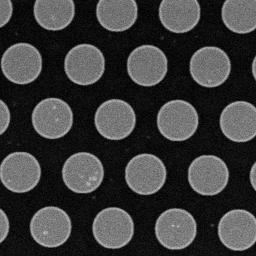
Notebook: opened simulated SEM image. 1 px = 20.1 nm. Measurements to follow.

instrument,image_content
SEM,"an array of small figures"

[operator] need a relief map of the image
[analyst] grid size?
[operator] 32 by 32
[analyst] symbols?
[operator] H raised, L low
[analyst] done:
HLLLHHHHHLLLHHHHHLLLHHHHHLLLHHHH
HHLLHHHHHLLLHHHHHLLLHHHHHLLLHHHH
HLLLLHHHHLLLHHHHHLLLHHHHHLLLHHHH
LLLLLLHHLLLLLHHHLLLLLHHHLLLLLHHH
LLLLLLLLLLLLLLLLLLLLLLLLLLLLLLLL
LLHLLLLLLLLLLLLLLLLLLLLLLLLLLLLL
LHHHHLLLLHHHHLLLHHHHLLLLLHHHLLLL
HHHHHLLLHHHHHLLLHHHHHLLLHHHHHLLL
HHHHHLLLHHHHHLLLHHHHHLLLHHHHHLLL
LHHHHLLLHHHHHLLLHHHHHLLLHHHHHLLL
LLLLLLLLLLHLLLLLLHHHLLLLLHHHLLLL
LLLLLLLLLLLLLLLLLLLLLLLLLLLLLLLL
LLLLLLHHLLLLLLHLLLLLLLLLLLLLLLLL
HLLLHHHHHLLLHHHHLLLLHHHHLLLLHHHH
HLLLHHHHHLLLHHHHHLLLHHHHHLLLHHHH
HLLLHHHHHLLLHHHHHLLLHHHHHLLLHHHH
LLLLLHHHLLLLHHHHLLLLHHHHLLLLHHHH
LLLLLLLLLLLLLLLLLLLLLHHLLLLLLHHL
LLLLLLLLLLLLLLLLLLLLLLLLLLLLLLLL
LHHHLLLLLHHHLLLLLHHLLLLLLHHLLLLL
HHHHHLLLHHHHHLLLHHHHLLLLHHHHLLLL
HHHHHLLLHHHHHLLLHHHHHLLLHHHHLLLH
HHHHHLLLHHHHHLLLHHHHHLLLHHHHLLLH
LHHHLLLLLHHHLLLLHHHHLLLLHHHHLLLL
LLLLLLLLLLLLLLLLLLLLLLLLLLLLLLLL
LLLLLLLLLLLLLLLLLLLLLLLLLLLLLLLL
LLLLLHHHLLLLLHHHLLLLLHHLLLLLHHHL
HLLLHHHHHLLLHHHHHLLLHHHHLLLLHHHH
HLLLHHHHHLLLHHHHHLLHHHHHLLLHHHHH
HLLLHHHHHLLLHHHHLLLLHHHHLLLHHHHH
LLLLLHHHLLLLLHHHLLLLHHHHLLLLHHHH
LLLLLLLLLLLLLLLLLLLLLLLLLLLLLLLL